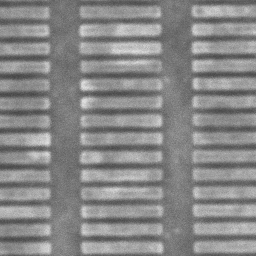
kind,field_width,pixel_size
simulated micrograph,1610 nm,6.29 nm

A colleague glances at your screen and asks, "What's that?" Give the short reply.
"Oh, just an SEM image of groups of lines, slits or small figures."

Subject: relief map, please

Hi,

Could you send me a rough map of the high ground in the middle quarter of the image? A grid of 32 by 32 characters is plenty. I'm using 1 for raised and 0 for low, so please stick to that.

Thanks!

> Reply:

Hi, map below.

00001111111111111111111100000000
00000111111111111111111100000000
00000000000000000000000000000000
00000000000000000000000000000000
00000111111111111111111100000000
00000111111111111111111100000000
00000000000000000000000000000000
00000000000000000000000000000000
00000000000000000000000000000000
00000111111111111111111100000000
00000111111111111111111100000000
00000000000000000000000000000000
00000000000000000000000000000000
00000111111111111111111100000000
00000111111111111111111100000000
00000000000000000000000000000000
00000000000000000000000000000000
00000000001111111111111100000000
00000111111111111111111100000000
00000111111111111111111100000000
00000000000000000000000000000000
00000000000000000000000000000000
00000111111111111111111100000000
00001111111111111111111100000000
00000100000000000000000000000000
00000000000000000000000000000000
00000000000000000000000000000000
00000111111111111111111100000000
00000111111111111111111100000000
00000000000000000000000000000000
00000000000000000000000000000000
00000111111111110001111100000000